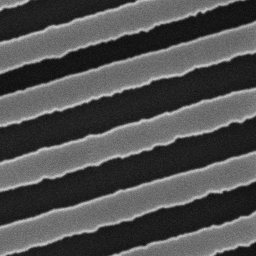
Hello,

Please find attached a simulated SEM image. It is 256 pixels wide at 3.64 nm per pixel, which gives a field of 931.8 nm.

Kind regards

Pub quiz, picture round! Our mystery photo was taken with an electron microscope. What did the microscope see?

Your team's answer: lines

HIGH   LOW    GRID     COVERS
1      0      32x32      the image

11100000000000001111111111111000
00000000000001111111111111000000
00000000011111111111110000000000
00000011111111111110000000000011
00011111111111100000000000111111
11111111111100000000000111111111
11111111100000000001111111111111
11111000000000011111111111110000
11000000000011111111111110000000
00000000111111111111110000000000
00000111111111111100000000000000
00111111111111100000000000000111
11111111111100000000000000111111
11111111100000000000000111111111
11111000000000000000111111111111
10000000000000001111111111111000
00000000000001111111111111000000
00000000001111111111110000000000
00000111111111111110000000000000
00011111111111110000000000000011
11111111111110000000000000111111
11111111100000000000000111111111
11111000000000000000111111111111
11000000000000001111111111111000
00000000000001111111111111000000
00000000001111111111111000000000
00000011111111111110000000000000
00011111111111110000000000000111
11111111111100000000000000111111
11111111100000000000001111111111
11111100000000000001111111111111
11100000000000011111111111110000